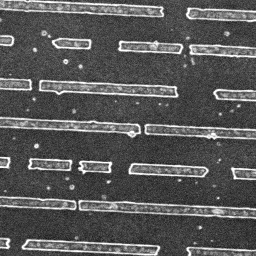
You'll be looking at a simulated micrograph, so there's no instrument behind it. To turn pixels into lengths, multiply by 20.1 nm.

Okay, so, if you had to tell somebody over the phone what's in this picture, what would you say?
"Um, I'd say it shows parallel lines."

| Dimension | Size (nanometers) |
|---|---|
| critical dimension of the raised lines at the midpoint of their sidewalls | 181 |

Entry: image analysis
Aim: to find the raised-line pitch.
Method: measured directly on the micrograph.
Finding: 800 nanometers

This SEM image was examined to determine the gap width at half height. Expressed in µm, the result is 0.608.